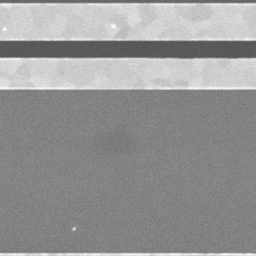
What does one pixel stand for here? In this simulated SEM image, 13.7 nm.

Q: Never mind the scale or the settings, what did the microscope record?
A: lines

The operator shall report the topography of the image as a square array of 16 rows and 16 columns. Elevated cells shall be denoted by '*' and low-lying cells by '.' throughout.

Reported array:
****************
****************
................
................
****************
****************
................
................
................
................
................
................
................
................
................
................